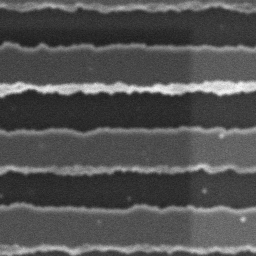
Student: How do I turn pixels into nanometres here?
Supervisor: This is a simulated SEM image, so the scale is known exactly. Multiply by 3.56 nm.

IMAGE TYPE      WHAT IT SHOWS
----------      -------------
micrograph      lines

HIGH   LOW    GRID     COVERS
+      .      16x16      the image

++..+++++++++.++
................
................
++++++++++++++++
++++++++++++++++
++++++++++++++++
................
................
++++++++++++++++
++++++++++++++++
++++++++++++++++
................
................
++++++++++++++++
++++++++++++++++
++++++++++++++++